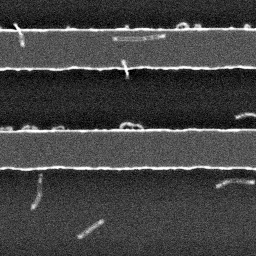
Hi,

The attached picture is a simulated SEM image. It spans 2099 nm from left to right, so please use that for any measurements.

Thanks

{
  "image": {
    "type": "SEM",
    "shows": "lines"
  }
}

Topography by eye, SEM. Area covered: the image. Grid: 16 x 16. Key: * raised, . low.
................
................
****************
****************
................
................
................
................
****************
****************
***.********.***
................
................
................
................
................